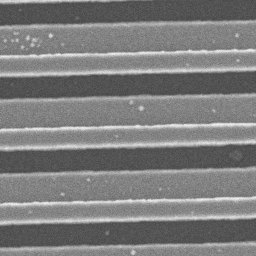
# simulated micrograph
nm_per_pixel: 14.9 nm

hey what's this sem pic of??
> lines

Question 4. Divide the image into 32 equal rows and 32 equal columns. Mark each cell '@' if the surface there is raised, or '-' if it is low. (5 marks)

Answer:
--------------------------------
--------------------------------
--------------------------------
@@@@@@@@@@@@@@@@@@@@@@@@@@@@@@@@
@@@@@@@@@@@@@@@@@@@@@@@@@@@@@@@@
@@@@@@@@@@@@@@@@@@@@@@@@@@@@@@@@
@@@@@@@@@@@@@@@@@@@@@@@@@@@@@@@@
@@@@@@@@@@@@@@@@@@@@@@@@@@@@@@@@
@@@@@@@@@@@@@@@@@@@@@@@@@@@@@@@@
--------------------------------
--------------------------------
--------------------------------
---@@@@@@@@@@@@@@@@@@@@@@@@@@@@@
@@@@@@@@@@@@@@@@@@@@@@@@@@@@@@@@
@@@@@@@@@@@@@@@@@@@@@@@@@@@@@@@@
@@@@@@@@@@@@@@@@@@@@@@@@@@@@@@@@
@@@@@@@@@@@@@@@@@@@@@@@@@@@@@@@@
@@@@@@@@@@@@@@@@@@@@@@@@@@@@@@@@
@@@@@@@-------------------------
--------------------------------
--------------------------------
---------------@@@@@@@@@@@@@@@@@
@@@@@@@@@@@@@@@@@@@@@@@@@@@@@@@@
@@@@@@@@@@@@@@@@@@@@@@@@@@@@@@@@
@@@@@@@@@@@@@@@@@@@@@@@@@@@@@@@@
@@@@@@@@@@@@@@@@@@@@@@@@@@@@@@@@
@@@@@@@@@@@@@@@@@@@@@@@@@@@@@@@@
@@@@@@@@@@@@@@@@@---------------
--------------------------------
--------------------------------
------------------------------@@
@@@@@@@@@@@@@@@@@@@@@@@@@@@@@@@@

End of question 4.